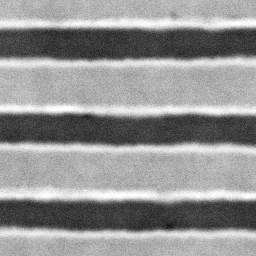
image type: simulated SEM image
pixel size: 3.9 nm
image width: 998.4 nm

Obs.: lines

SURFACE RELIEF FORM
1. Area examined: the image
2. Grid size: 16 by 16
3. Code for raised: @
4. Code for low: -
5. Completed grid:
@@@@@@@@@@@@@@@@
@@@@@@@@@@@@@@@@
----------------
----------------
@@@@@@@@@@@@@@@@
@@@@@@@@@@@@@@@@
@@@@@@@@@@@@@@@@
----------------
----------------
@@@@@@@@@@@@@@@@
@@@@@@@@@@@@@@@@
@@@@@@@@@@@@@@@@
----------------
----------------
----------------
@@@@@@@@@@@@@@@@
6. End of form